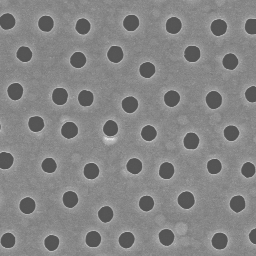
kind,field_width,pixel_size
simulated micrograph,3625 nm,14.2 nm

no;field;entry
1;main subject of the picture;a regular array of holes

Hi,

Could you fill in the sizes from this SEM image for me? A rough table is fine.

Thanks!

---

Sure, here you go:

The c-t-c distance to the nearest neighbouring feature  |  498 nanometres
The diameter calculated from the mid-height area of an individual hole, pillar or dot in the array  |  16.3 px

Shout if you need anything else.